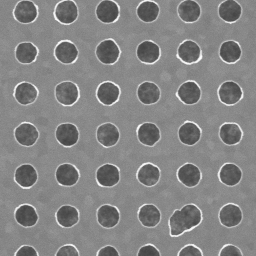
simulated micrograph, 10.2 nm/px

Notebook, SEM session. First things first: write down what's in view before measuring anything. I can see a regular array of holes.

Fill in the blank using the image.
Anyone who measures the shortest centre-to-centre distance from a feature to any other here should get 414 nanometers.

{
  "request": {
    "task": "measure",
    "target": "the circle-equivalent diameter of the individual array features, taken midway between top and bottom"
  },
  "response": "0.229 um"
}